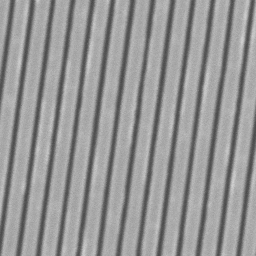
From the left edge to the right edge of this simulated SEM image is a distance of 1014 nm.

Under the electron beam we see parallel lines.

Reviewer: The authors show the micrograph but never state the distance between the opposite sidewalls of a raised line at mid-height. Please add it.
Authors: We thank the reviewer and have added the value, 54.4 nm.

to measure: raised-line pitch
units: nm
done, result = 78.4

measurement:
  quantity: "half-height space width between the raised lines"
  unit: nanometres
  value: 23